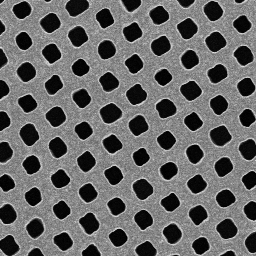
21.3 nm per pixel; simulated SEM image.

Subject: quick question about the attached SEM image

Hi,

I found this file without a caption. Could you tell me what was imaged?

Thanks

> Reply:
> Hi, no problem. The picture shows a regular array of holes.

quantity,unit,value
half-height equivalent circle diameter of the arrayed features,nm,379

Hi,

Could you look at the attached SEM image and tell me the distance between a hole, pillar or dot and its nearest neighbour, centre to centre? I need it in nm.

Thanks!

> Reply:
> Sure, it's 653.